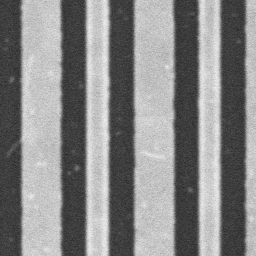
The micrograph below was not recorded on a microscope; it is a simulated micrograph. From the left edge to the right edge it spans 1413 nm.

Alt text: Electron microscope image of lines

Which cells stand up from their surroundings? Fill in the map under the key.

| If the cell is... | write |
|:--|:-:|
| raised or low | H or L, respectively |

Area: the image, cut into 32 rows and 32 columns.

LLLHHHHLLLLHHLLLLHHHHHLLLHHLLLLH
LLLHHHHLLLLHHLLLLHHHHHLLLHHLLLLH
LLLHHHHLLLLHHLLLLHHHHHLLLHHLLLLH
LLLHHHHLLLLHHLLLLHHHHHLLLHHLLLLH
LLLHHHHHLLLHHLLLLHHHHHLLLHHLLLLH
LLLHHHHHLLLHHLLLLHHHHHLLLHHLLLLH
LLLHHHHHLLLHHLLLLHHHHHLLLHHLLLLH
LLLHHHHHLLLHHLLLLHHHHHLLLHHLLLLH
LLLHHHHHLLLHHLLLLHHHHHLLLHHLLLLH
LLLHHHHHLLLHHLLLLHHHHHLLLHHLLLLH
LLLHHHHLLLLHHLLLLHHHHHLLLHHLLLLH
LLLHHHHHLLLHHLLLLHHHHHLLLHHLLLLH
LLLHHHHHLLLHHLLLLHHHHHLLLHHLLLLH
LLLHHHHHLLLHHLLLLHHHHHLLLHHLLLLH
LLLHHHHHLLLHHLLLLHHHHHLLLHHLLLLH
LLLHHHHLLLLHHLLLLHHHHHLLLHHLLLLH
LLLHHHHLLLLHHLLLLHHHHHLLLHHLLLLH
LLLHHHHHLLLHHLLLLHHHHHLLLHHLLLLH
LLLHHHHLLLLHHLLLLHHHHHLLLHHLLLLH
LLLHHHHLLLLHHLLLLHHHHHLLLHHLLLLH
LLLHHHHLLLLHHLLLLHHHHHLLLHHLLLLH
LLLHHHHHLLLHHLLLLHHHHHLLLHHLLLLH
LLLHHHHHLLLHHLLLLHHHHHLLLHHLLLLH
LLLHHHHHLLLHHLLLLHHHHHLLLHHLLLLH
LLLHHHHHLLLHHLLLLHHHHHLLLHHLLLLH
LLLHHHHHLLLHHLLLLHHHHHLLLHHLLLLH
LLLHHHHLLLLHHLLLLHHHHHLLLHHLLLLH
LLLHHHHLLLLHHLLLLHHHHHLLLHHLLLLH
LLLHHHHHLLLHHLLLLHHHHHLLLHHLLLLH
LLLHHHHHLLLHHLLLLHHHHHLLLHHLLLLH
LLLHHHHLLLLHHLLLLHHHHHLLLHHLLLLH
LLLHHHHHLLLHHLLLLHHHHHLLLHHLLLLH